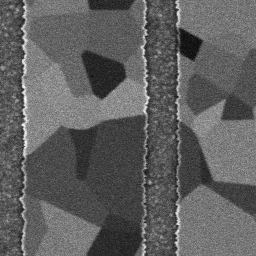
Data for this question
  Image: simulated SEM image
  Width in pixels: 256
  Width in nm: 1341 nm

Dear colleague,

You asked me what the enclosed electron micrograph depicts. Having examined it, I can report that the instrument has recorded one or a few lines or trenches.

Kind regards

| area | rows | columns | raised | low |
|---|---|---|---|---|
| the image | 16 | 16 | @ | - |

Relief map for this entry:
-@@@@@@@@--@@@@@
-@@@@@@@@--@@@@@
-@@@@@@@@--@@@@@
-@@@@@@@@--@@@@@
-@@@@@@@@--@@@@@
-@@@@@@@@--@@@@@
--@@@@@@@--@@@@@
--@@@@@@@--@@@@@
--@@@@@@@--@@@@@
--@@@@@@@--@@@@@
-@@@@@@@@--@@@@@
-@@@@@@@@--@@@@@
-@@@@@@@@--@@@@@
-@@@@@@@@--@@@@@
-@@@@@@@@--@@@@@
-@@@@@@@@--@@@@@